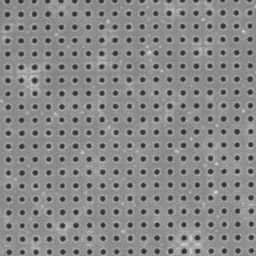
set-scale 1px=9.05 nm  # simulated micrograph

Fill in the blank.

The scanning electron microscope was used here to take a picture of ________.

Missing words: a regular array of holes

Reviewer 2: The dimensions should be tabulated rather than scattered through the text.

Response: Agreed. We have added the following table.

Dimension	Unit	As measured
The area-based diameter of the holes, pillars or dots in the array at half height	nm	52.1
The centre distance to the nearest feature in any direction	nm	118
